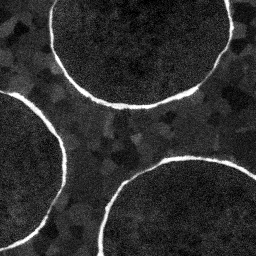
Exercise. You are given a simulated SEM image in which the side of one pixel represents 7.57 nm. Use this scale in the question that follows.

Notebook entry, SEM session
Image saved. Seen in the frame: holes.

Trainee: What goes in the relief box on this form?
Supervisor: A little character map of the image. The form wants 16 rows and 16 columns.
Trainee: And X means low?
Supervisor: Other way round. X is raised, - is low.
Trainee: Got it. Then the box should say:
XXX-----------XX
XXX-----------XX
XXX-----------XX
XXXX----------XX
XXXX---------XXX
XXXXX-------XXXX
--XXXXX---XXXXXX
---XXXXXXXXXXXXX
---XXXXXXXXXXXXX
----XXXXXXXXXXXX
----XXXXXX-----X
----XXXX--------
---XXXX---------
---XXXX---------
--XXXX----------
XXXXXX----------